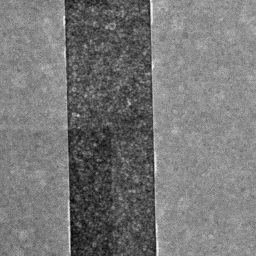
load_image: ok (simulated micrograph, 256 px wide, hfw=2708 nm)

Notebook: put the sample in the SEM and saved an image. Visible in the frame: one or a few lines or trenches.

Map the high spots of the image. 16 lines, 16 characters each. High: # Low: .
####.....#######
####.....#######
####.....#######
####.....#######
####.....#######
####.....#######
####......######
####......######
####......######
####......######
####......######
####......######
####......######
####......######
####......######
####......######